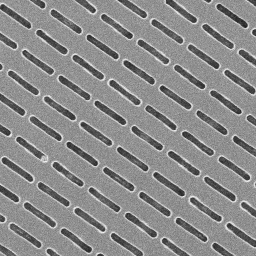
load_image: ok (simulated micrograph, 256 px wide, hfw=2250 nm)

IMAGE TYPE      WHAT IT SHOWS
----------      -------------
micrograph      a regular array of holes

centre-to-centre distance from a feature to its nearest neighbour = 0.217 micrometres